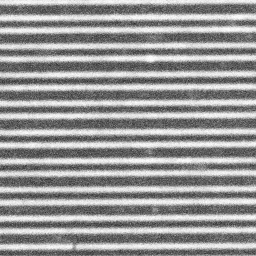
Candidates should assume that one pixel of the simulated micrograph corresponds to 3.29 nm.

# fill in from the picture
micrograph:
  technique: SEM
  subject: parallel lines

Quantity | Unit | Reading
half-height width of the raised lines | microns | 0.0115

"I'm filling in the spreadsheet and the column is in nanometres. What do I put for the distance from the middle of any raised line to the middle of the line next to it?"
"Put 47.2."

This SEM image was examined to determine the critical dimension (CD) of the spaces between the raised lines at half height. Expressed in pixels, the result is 11.4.